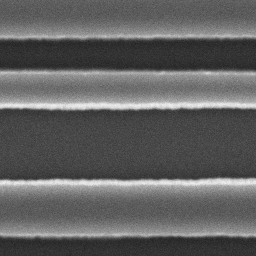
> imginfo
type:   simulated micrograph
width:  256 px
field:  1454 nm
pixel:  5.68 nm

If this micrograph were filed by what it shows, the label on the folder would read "lines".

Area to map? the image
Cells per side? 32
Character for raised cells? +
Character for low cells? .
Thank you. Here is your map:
++++++++++++++++++++++++++++++++
++++++++++++++++++++++++++++++++
++++++++++++++++++++++++++++++++
++++++++++++++++++++++++++++++++
++++++++++++++++++++++++++++++++
................................
................................
................................
................................
++++++++++++++++++++++++++++++++
++++++++++++++++++++++++++++++++
++++++++++++++++++++++++++++++++
++++++++++++++++++++++++++++++++
................................
................................
................................
................................
................................
................................
................................
................................
................................
................................
++++++++++++++++++++++++++++++++
++++++++++++++++++++++++++++++++
++++++++++++++++++++++++++++++++
++++++++++++++++++++++++++++++++
++++++++++++++++++++++++++++++++
++++++++++++++++++++++++++++++++
................................
................................
................................